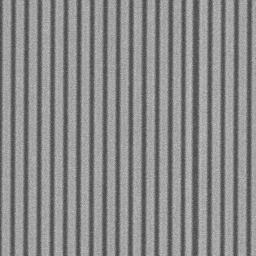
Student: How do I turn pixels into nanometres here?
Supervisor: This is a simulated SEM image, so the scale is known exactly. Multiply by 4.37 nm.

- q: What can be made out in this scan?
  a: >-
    parallel lines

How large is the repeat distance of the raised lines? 57.3 nm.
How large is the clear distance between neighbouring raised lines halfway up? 23.5 nm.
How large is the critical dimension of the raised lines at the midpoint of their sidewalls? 35.5 nm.